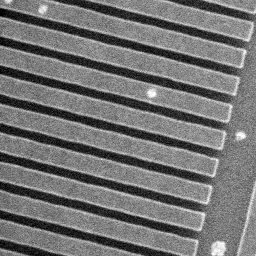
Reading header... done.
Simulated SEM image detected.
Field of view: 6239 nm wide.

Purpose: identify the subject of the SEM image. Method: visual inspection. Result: groups of lines, slits or small figures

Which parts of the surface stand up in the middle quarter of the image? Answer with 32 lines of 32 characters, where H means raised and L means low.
HHHHLLLLLLLLLLHHHHHHHHHHHHHHHHHH
HHHHHHHHLLLLLLLLLHHHHHHHHHHHHHHH
HHHHHHHHHHHHLLLLLLLLLLHHHHHHHHHH
HHHHHHHHHHHHHHHLLLLLLLLLLLHHHHHH
LHHHHHHHHHHHHHHHHHHLLLLLLLLLLHHH
LLLLLHHHHHHHHHHHHHHHHHHLLLLLLLLL
LLLLLLLLLHHHHHHHHHHHHHHHHHHLLLLL
HHHLLLLLLLLLLHHHHHHHHHHHHHHHHHHH
HHHHHHLLLLLLLLLLLHHHHHHHHHHHHHHH
HHHHHHHHHHHLLLLLLLLLLHHHHHHHHHHH
HHHHHHHHHHHHHHLLLLLLLLLLLHHHHHHH
HHHHHHHHHHHHHHHHHHLLLLLLLLLLLHHH
LLLLHHHHHHHHHHHHHHHHHHLLLLLLLLLL
LLLLLLLLHHHHHHHHHHHHHHHHHHLLLLLL
HHLLLLLLLLLLHHHHHHHHHHHHHHHHHHLL
HHHHHHLLLLLLLLLLHHHHHHHHHHHHHHHH
HHHHHHHHHHLLLLLLLLLLHHHHHHHHHHHH
HHHHHHHHHHHHHHLLLLLLLLLLHHHHHHHH
HHHHHHHHHHHHHHHHHLLLLLLLLLLLHHHH
LLLLHHHHHHHHHHHHHHHHHLLLLLLLLLLL
LLLLLLLHHHHHHHHHHHHHHHHHHLLLLLLL
HLLLLLLLLLLHHHHHHHHHHHHHHHHHHHLL
HHHHLLLLLLLLLLHHHHHHHHHHHHHHHHHH
HHHHHHHHHLLLLLLLLLLHHHHHHHHHHHHH
HHHHHHHHHHHHLLLLLLLLLLLHHHHHHHHH
HHHHHHHHHHHHHHHHHLLLLLLLLLHHHHHH
LLHHHHHHHHHHHHHHHHHHHLLLLLLLLLLH
LLLLLLHHHHHHHHHHHHHHHHHHLLLLLLLL
LLLLLLLLLLHHHHHHHHHHHHHHHHHHHLLL
HHHHLLLLLLLLLHHHHHHHHHHHHHHHHHHH
HHHHHHHHLLLLLLLLLLHHHHHHHHHHHHHH
HHHHHHHHHHHHLLLLLLLLLLHHHHHHHHHH